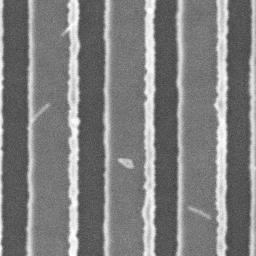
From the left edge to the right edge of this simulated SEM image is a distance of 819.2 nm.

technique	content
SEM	lines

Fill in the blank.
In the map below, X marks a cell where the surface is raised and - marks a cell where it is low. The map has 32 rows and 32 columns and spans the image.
----XXXXXX---XXXXXX----XXXXX----
----XXXXXX---XXXXXX----XXXXX----
----XXXXXX---XXXXXX---XXXXXX----
----XXXXXX---XXXXXX---XXXXXX----
----XXXXXX---XXXXXX---XXXXXX----
----XXXXXX---XXXXXX---XXXXXX----
----XXXXXX---XXXXXX----XXXXX----
----XXXXXX---XXXXXX----XXXXX---X
----XXXXXX---XXXXXX----XXXXX----
----XXXXXX---XXXXXX---XXXXXX----
----XXXXXX---XXXXXX---XXXXXX----
----XXXXXX---XXXXXX----XXXXX----
----XXXXXX---XXXXXX----XXXXX----
----XXXXXX---XXXXXX---XXXXXX----
----XXXXXX---XXXXXX---XXXXXX---X
----XXXXXX---XXXXXX---XXXXXX----
----XXXXXX---XXXXXX---XXXXXX----
----XXXXXX---XXXXXX---XXXXXX----
----XXXXXX---XXXXXX---XXXXXX----
----XXXXXX---XXXXXX---XXXXXX----
----XXXXXX---XXXXXX---XXXXXX----
----XXXXXX---XXXXXX---XXXXXX----
----XXXXXX---XXXXXX---XXXXXX----
----XXXXXX---XXXXXX---XXXXXX----
----XXXXXX---XXXXXX---XXXXXX----
----XXXXXX---XXXXXX---XXXXXX----
----XXXXXX---XXXXXX---XXXXXX---X
----XXXXXX---XXXXXX---XXXXXX----
----XXXXXX---XXXXXX---XXXXXX----
----XXXXX----XXXXXX---XXXXXX----
----XXXXXX---XXXXXX---XXXXXX---X
----XXXXXX---XXXXXX---XXXXXX---X